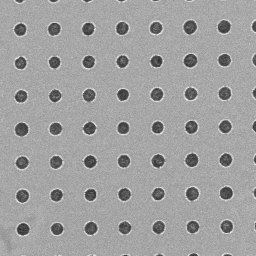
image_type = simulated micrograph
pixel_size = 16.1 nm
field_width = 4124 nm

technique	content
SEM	a regular array of holes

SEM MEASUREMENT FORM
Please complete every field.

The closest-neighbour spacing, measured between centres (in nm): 532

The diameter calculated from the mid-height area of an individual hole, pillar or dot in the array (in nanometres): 214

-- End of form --